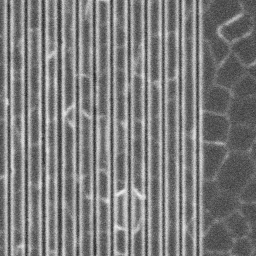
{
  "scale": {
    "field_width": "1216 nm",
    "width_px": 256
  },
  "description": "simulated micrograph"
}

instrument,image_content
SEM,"parallel lines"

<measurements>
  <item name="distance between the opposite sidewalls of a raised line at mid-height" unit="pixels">13.1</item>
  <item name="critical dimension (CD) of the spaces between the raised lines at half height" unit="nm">20.8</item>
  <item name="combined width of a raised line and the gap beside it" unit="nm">81.7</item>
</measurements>